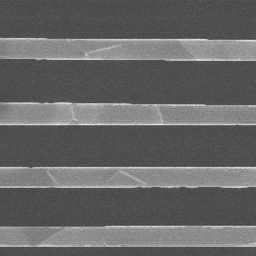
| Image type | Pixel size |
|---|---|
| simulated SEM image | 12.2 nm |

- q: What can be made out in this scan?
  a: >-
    lines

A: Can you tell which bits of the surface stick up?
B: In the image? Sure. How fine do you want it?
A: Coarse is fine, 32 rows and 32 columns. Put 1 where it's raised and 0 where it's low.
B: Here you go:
00000000000000000000000000000000
00000000000000000000000000000000
00000000000000000000000000000000
00000000000000000000000000000000
00000000000000000000000000000000
11111111111111111111111111111111
11111111111111111111111111111111
00000000000000000000011111111111
00000000000000000000000000000000
00000000000000000000000000000000
00000000000000000000000000000000
00000000000000000000000000000000
00000000000000000000000000000000
11111111111111111111111111111111
11111111111111111111111111111111
11111111111111111111111111111111
00000000000000000000000000000000
00000000000000000000000000000000
00000000000000000000000000000000
00000000000000000000000000000000
00000000000000000000000000000000
11111111111111111111111111111111
11111111111111111111111111111111
00000000000000000000000000000000
00000000000000000000000000000000
00000000000000000000000000000000
00000000000000000000000000000000
00000000000000000000000000000000
11111111111111111111111111111111
11111111111111111111111111111111
11111111111111111111111111111111
00000000000000000000000000000000